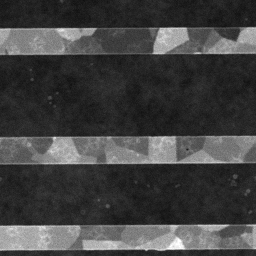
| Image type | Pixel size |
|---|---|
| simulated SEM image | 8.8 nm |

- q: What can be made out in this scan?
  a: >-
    one or a few lines or trenches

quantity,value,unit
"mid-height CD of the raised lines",222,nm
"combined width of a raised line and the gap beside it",0.865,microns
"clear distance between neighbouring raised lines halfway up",0.642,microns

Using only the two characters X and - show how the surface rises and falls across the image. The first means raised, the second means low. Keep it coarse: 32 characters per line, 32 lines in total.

--------------------------------
--------------------------------
--------------------------------
--------------------------------
XXXXXXXXXXXXXXXXXXXXXXXXXXXXXXXX
XXXXXXXXXXXXXXXXXXXXXXXXXXXXXXXX
XXXXXXXXXXXXXXXXXXXXXXXXXXXXXXXX
--------------------------------
--------------------------------
--------------------------------
--------------------------------
--------------------------------
--------------------------------
--------------------------------
--------------------------------
--------------------------------
--------------------------------
XXXXXXXXXXXXXXXXXXXXXXXXXXXXXXXX
XXXXXXXXXXXXXXXXXXXXXXX-XXXXXXXX
XXXXXXXXXXXXXXXXXXXXXXXXXXXXXXXX
--------------------------------
--------------------------------
--------------------------------
--------------------------------
--------------------------------
--------------------------------
--------------------------------
--------------------------------
XXXXXXXXXXXXXXXXXXXXXXXXXXXXXXXX
XXXXXXXXXXXXXXXXXXXXXXXXXXXXXXXX
XXXXXXXXXXXXXXXXXXXXXXXXXXXXXXXX
--------------------------------